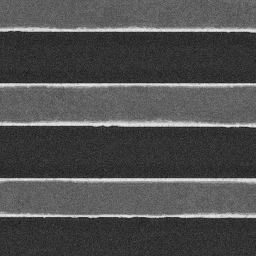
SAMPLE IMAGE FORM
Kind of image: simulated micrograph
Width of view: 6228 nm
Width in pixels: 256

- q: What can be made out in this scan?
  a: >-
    lines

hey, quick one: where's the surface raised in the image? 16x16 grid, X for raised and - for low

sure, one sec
XXXXXXXXXXXXXXXX
XXXXXXXXXXXXXXXX
----------------
----------------
----------------
XXXXXXXXXXXXXXXX
XXXXXXXXXXXXXXXX
XXXXXXXXXXXXXXXX
----------------
----------------
----------------
XXXXXXXXXXXXXXXX
XXXXXXXXXXXXXXXX
XXXXXXXXXXXXXXXX
----------------
----------------